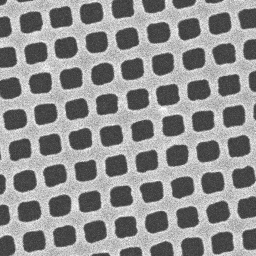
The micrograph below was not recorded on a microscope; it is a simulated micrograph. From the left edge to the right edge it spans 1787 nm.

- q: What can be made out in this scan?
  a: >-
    a regular array of holes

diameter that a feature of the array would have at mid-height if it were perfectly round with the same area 0.165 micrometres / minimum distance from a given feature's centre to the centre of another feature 213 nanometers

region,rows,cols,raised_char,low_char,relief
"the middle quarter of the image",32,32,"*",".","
*******.....**......**......**..
....***.....**......**.....****.
.....**......*......***...******
.....**......**....*************
.....**.....*******************.
.....*******************....***.
.***************.....**......**.
**********...***.....**......**.
********.....***.....**......**.
*.....**......**.....**......***
......**......**.....***.*******
......**......***..*************
......**.....*******************
*....********************.....**
******************....**......**
***********...***.....***.....**
***....**.....***......*......**
*......**......**......**.....**
*......**......**.....**********
*......**......*****************
**.....***..***************....*
***.*****************..***.....*
**************.***.....**......*
***********.....**......*......*
***.....**......**......**.....*
***.....**......**......**...***
.**.....**......**....**********
.**.....***....*****************
.**.....********************....
****.****************...***.....
*************...***......**.....
************.....**......**.....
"